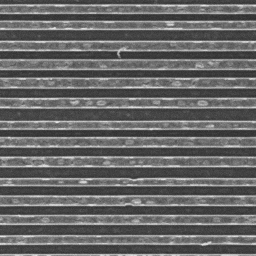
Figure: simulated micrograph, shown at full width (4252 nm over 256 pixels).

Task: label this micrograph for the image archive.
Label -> parallel lines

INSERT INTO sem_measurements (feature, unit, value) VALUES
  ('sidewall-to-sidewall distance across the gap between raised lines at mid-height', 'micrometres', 0.164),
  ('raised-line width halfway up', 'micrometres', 0.152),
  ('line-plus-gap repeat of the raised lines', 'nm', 319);